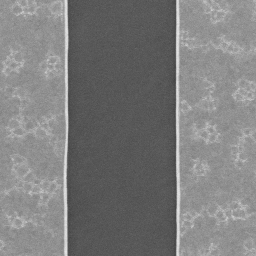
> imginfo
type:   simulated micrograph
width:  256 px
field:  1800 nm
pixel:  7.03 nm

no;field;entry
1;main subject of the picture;one or a few lines or trenches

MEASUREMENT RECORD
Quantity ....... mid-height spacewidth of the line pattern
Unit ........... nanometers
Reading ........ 784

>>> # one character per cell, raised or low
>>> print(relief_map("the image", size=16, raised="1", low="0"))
1111000000011111
1111000000011111
1111000000011111
1111000000011111
1111000000011111
1111000000011111
1111000000011111
1111000000011111
1111000000011111
1111000000011111
1111000000011111
1111000000011111
1111000000011111
1111000000011111
1111000000011111
1111000000011111